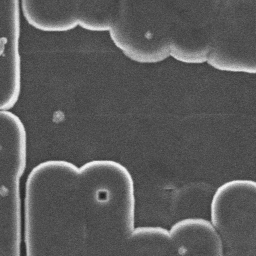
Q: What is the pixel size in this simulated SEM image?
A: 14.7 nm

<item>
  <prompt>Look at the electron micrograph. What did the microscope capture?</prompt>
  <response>wiring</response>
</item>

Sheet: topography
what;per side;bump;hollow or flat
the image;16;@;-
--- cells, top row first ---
@@@@@@@@@@@@@@@@
@-@@@@@@@@@@@@@@
@------@@@@@@@@@
@--------@-@@@@@
@---------------
@---------------
@---------------
@---------------
@---------------
@---------------
@-@@@@@@--------
@-@@@@@@------@@
@@@@@@@@-----@@@
@@@@@@@@-----@@@
@@@@@@@@@@@@@@@@
@@@@@@@@@@@@@@@@